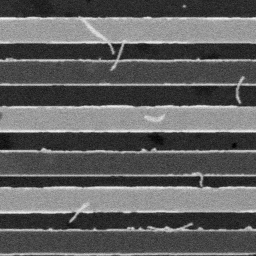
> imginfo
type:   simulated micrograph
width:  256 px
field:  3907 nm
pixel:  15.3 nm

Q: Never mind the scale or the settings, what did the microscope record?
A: lines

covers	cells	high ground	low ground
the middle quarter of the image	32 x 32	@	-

@@@@@@@@@@@@@@@@@@@@@@@@@@@@@@@@
@@@@@@@@@@@@@@@@@@@@@@@@@@@@@@@@
@@@@@@@@@@@@@@@@@@@@@@@@@@@@@@@@
@@@@@@@@@@@@@@@@@@@@@@@@@@@@@@@@
@@@@@@@@@@@@@@@@@@@@@@@@@@@@@@@@
--------------------------------
--------------------------------
--------------------------------
--------------------------------
--------------------------------
--------------------------------
@@@@@@@@@@@@@@@@@@@@@@@@@@@@@@@@
@@@@@@@@@@@@@@@@@@@@@@@@@@@@@@@@
@@@@@@@@@@@@@@@@@@@@@@@@@@@@@@@@
@@@@@@@@@@@@@@@@@@@@@@@@@@@@@@@@
@@@@@@@@@@@@@@@@@@@@@@@@@@@@@@@@
@@@@@@@@@@@@@@@@@@@@@@@@@@@@@@@@
--------------------------------
--------------------------------
--------------------------------
--------------------------------
--------------------------------
@@@@@@@@@@@@@@@@@@@@@@@@@@@@@@@@
@@@@@@@@@@@@@@@@@@@@@@@@@@@@@@@@
@@@@@@@@@@@@@@@@@@@@@@@@@@@@@@@@
@@@@@@@@@@@@@@@@@@@@@@@@@@@@@@@@
@@@@@@@@@@@@@@@@@@@@@@@@@@@@@@@@
@@@@@@@@@@@@@@@@@@@@@@@@@@@@@@@@
--------------------------------
--------------------------------
--------------------------------
@@@@@@@@@@@@@@@@@@@@@@@@@@@@@@@@